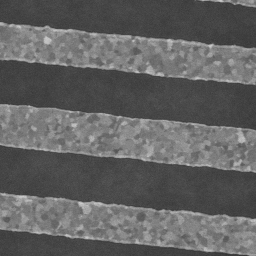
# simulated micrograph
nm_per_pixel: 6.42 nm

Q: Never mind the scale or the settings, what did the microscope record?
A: lines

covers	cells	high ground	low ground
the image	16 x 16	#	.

................
#...............
###########.....
################
........########
................
................
##########......
################
...#############
..............##
................
#####...........
##############..
..##############
...........#####